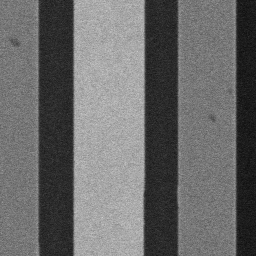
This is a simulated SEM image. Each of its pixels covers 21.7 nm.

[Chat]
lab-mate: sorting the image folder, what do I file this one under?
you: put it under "lines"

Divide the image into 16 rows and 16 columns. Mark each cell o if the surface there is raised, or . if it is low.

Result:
oo...oooo..oooo.
oo...oooo..oooo.
oo...oooo..oooo.
oo...oooo..oooo.
oo...oooo..oooo.
oo...oooo..oooo.
oo...oooo..oooo.
oo...oooo..oooo.
oo...oooo..oooo.
oo...oooo..oooo.
oo...oooo..oooo.
oo...oooo..oooo.
oo...oooo..oooo.
oo...oooo..oooo.
oo...oooo..oooo.
oo...oooo..oooo.